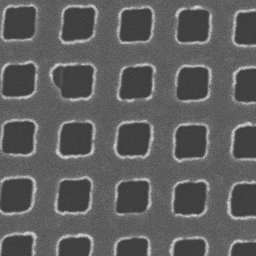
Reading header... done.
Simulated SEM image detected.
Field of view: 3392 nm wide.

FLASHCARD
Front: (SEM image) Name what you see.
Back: a regular array of holes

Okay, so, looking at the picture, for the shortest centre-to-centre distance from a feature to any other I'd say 0.754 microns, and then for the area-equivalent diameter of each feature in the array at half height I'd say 461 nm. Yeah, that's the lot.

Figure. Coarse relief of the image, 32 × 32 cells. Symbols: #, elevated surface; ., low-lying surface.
################################
#...####....###....####...#####.
#...####....###....###....####..
....####....###....###....###...
#...####...####....###....###...
##############################..
################################
################################
#...###.....####...####...######
....###.....###....###....####..
....###.....###....###....####..
....####...####....###....###...
#######################.######..
################################
################################
#...####...#####..##############
....####...####....###....###...
....####....###....###....###...
....####...####...####....###...
######################...####...
################################
################################
#...####...#####################
....###....####....###....###...
....###....####....###....###...
....###....####...####....###...
#.#############...####...####...
################################
################################
##.#############################
....###....####...####....###...
....###....####...####....###...